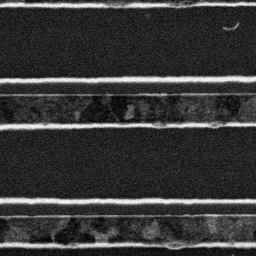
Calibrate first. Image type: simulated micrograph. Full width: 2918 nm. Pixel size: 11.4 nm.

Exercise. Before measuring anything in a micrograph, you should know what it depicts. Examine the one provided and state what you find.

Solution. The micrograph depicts lines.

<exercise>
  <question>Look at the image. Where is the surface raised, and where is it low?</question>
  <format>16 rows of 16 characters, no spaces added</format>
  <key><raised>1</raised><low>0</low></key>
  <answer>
0000000000000000
0000000000000000
0000000000000000
0000000000000000
0000000000000000
1111111111111111
1111111111111111
1111111111111111
0000000000000000
0000000000000000
0000000000000000
0000000000000000
0000000000000000
1111111111111111
1111111111111111
0000000000110000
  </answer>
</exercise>